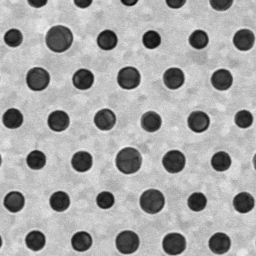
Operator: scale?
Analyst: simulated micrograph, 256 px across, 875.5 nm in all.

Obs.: a regular array of holes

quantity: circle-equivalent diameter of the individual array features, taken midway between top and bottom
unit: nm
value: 76.5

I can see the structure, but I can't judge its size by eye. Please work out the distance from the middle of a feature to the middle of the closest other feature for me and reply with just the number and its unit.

155 nm